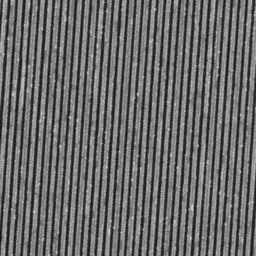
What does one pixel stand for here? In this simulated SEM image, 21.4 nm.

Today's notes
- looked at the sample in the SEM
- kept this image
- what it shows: parallel lines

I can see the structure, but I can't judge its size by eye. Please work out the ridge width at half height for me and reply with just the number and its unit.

74.8 nanometres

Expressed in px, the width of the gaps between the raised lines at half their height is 3.49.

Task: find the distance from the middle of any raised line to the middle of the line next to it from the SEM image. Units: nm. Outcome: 158